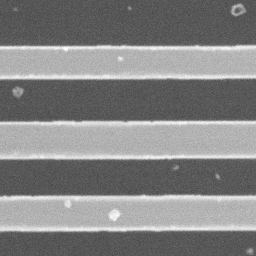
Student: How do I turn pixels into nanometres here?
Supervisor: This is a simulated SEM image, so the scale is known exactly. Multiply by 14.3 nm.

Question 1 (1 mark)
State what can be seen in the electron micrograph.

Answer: lines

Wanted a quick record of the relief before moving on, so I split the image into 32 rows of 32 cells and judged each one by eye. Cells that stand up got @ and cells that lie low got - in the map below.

--------------------------------
-----------------------------@--
--------------------------------
--------------------------------
--------------------------------
--------------------------------
@@@@@@@@@@@@@@@@@@@@@@@@@@@@@@@@
@@@@@@@@@@@@@@@@@@@@@@@@@@@@@@@@
@@@@@@@@@@@@@@@@@@@@@@@@@@@@@@@@
@@@@@@@@@@@@@@@@@@@-@@@@@@@@@@@@
--------------------------------
--------------------------------
--------------------------------
--------------------------------
--------------------------------
@@@@@@@@@@@@@@@@@@@@@@@@@@@@@@@@
@@@@@@@@@@@@@@@@@@@@@@@@@@@@@@@@
@@@@@@@@@@@@@@@@@@@@@@@@@@@@@@@@
@@@@@@@@@@@@@@@@@@@@@@@@@@@@@@@@
@@@@@@@@@@@@@@@@@@@@@@@@@@@@@@@@
--------------------------------
--------------------------------
--------------------------------
--------------------------------
--------------------------------
@@@@@@@@@@@@@@@@@@@@@@@@@@@@@@@@
@@@@@@@@@@@@@@@@@@@@@@@@@@@@@@@@
@@@@@@@@@@@@@@@@@@@@@@@@@@@@@@@@
@@@@@@@@@@@@@@@@@@@@@@@@@@@@@@@@
--------------------------------
--------------------------------
--------------------------------